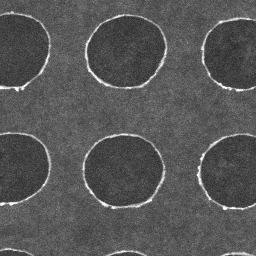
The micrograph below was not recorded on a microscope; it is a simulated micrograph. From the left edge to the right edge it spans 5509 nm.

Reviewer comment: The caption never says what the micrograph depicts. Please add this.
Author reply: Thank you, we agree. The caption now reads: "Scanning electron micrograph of holes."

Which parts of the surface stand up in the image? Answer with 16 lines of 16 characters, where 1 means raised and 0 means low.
1111111111111111
0001110000111100
0001110000111000
0001100000111000
0011110000111000
1111111111111110
1111111111111111
1111111111111111
0011111011111100
0001110000111000
0001100000111000
0001100000111000
0111110001111000
1111111111111111
1111111111111111
1111111111111111